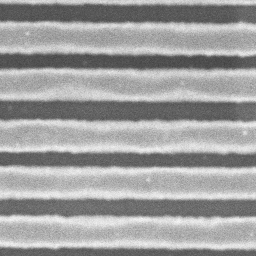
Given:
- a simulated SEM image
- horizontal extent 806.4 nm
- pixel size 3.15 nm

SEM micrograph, lines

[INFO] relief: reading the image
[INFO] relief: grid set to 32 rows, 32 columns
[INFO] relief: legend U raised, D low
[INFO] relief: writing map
DDDDDDDDDDDDDDDUUUUDUUDDDDUUUUUU
DDDDDDDDDDDDDDDDDDDDDDDDDDDDDDDD
DDDDDDDDDDDDDDDDDDDDDDDDDDDDDDDD
UUUUUUUUUUUUUUUUUUUUUUUUUUUUUUUU
UUUUUUUUUUUUUUUUUUUUUUUUUUUUUUUU
UUUUUUUUUUUUUUUUUUUUUUUUUUUUUUUU
UUUUUUUUUUUUUUUUUUUUUUUUUUUUUUUU
DDDDDDDDDDDDDDDDDDDDDDDDDDDDDDDD
DDDDDDDDDDDDDDDDDDDDDDDDDDDDDDDD
UUUUUUUUUUUUUUUUUUUUUUUUUUUUUUUU
UUUUUUUUUUUUUUUUUUUUUUUUUUUUUUUU
UUUUUUUUUUUUUUUUUUUUUUUUUUUUUUUU
DUDDDDDDDDDDDDUUUUUUUUUDUUUUUUUU
DDDDDDDDDDDDDDDDDDDDDDDDDDDDDDDD
DDDDDDDDDDDDDDDDDDDDDDDDDDDDDDDD
UUUUUUUUUUUUUUUUUUUUUUUUUUUUUUUU
UUUUUUUUUUUUUUUUUUUUUUUUUUUUUUUU
UUUUUUUUUUUUUUUUUUUUUUUUUUUUUUUU
UUUUUUUUUUUUUUUUUUUUUUUUUUUUUUUU
DDDDDDDDDDDDDDDDDDDDDDDDDDDDDDDD
DDDDDDDDDDDDDDDDDDDDDDDDDDDDDDDD
UUUUUUUUUUUUUUUUUUUUUUUUUUUUUUUU
UUUUUUUUUUUUUUUUUUUUUUUUUUUUUUUU
UUUUUUUUUUUUUUUUUUUUUUUUUUUUUUUU
UUUUUUUUUUUUUUUUUUUUUUUUUUUUUUUU
DDDDDDDDDDDDDDDDDDDDDDDDDDDDDDDD
DDDDDDDDDDDDDDDDDDDDDDDDDDDDDDDD
UUUUUUUUUUUUUUUUUUUUUUUUUUUUUUUU
UUUUUUUUUUUUUUUUUUUUUUUUUUUUUUUU
UUUUUUUUUUUUUUUUUUUUUUUUUUUUUUUU
UUUUUUUUUUUUUUUUUUUUUUUUUUUUUUUU
DDDDDDDDDDDDDDDDDDDDDDDDDDDDDDDD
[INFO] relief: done